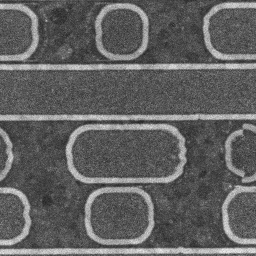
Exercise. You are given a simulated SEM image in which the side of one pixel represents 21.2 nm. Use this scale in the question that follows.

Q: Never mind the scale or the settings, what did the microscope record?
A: parallel lines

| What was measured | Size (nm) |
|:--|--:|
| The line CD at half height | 210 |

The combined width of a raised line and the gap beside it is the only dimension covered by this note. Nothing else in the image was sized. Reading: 1.31 um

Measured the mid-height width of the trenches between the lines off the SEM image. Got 1090 nm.